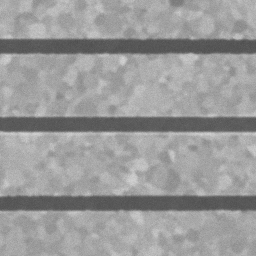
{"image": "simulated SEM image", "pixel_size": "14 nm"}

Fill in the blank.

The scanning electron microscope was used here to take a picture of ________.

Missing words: lines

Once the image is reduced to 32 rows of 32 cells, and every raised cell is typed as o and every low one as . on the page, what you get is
oooooooooooooooooooooooooooooooo
oooooooooooooooooooooooooooooooo
oooooooooooooooooooooooooooooooo
oooooooooooooooooooooooooooooooo
oooooooooooooooooooooooooooooooo
................................
................................
oooooooooooooooooooooooooooooooo
oooooooooooooooooooooooooooooooo
oooooooooooooooooooooooooooooooo
oooooooooooooooooooooooooooooooo
oooooooooooooooooooooooooooooooo
oooooooooooooooooooooooooooooooo
oooooooooooooooooooooooooooooooo
................................
................................
................................
oooooooooooooooooooooooooooooooo
oooooooooooooooooooooooooooooooo
oooooooooooooooooooooooooooooooo
oooooooooooooooooooooooooooooooo
oooooooooooooooooooooooooooooooo
oooooooooooooooooooooooooooooooo
oooooooooooooooooooooooooooooooo
................................
................................
oooooooooooooooooooooooooooooooo
oooooooooooooooooooooooooooooooo
oooooooooooooooooooooooooooooooo
oooooooooooooooooooooooooooooooo
oooooooooooooooooooooooooooooooo
oooooooooooooooooooooooooooooooo